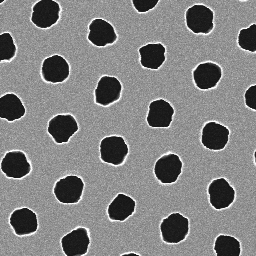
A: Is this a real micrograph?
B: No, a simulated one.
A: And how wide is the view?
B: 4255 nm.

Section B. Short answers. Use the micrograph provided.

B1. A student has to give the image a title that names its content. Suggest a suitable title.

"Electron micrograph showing a regular array of holes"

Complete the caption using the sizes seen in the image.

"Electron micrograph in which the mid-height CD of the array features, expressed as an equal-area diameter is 0.454 microns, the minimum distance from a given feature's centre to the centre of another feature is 56 px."